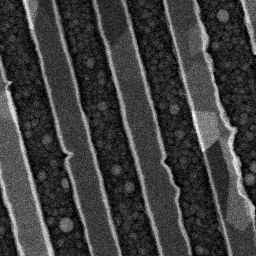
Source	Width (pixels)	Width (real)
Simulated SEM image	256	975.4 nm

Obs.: one or a few lines or trenches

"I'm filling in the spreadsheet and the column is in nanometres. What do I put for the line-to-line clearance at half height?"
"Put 148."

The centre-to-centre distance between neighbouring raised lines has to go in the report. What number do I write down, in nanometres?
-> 258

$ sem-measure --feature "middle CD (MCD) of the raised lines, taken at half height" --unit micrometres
0.107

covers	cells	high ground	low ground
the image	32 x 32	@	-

---@@@@-----@@@@-----@@@@-----@@
---@@@@-----@@@@-----@@@@------@
----@@@-----@@@@-----@@@@------@
----@@@------@@@-----@@@@------@
----@@@@-----@@@@-----@@@@-----@
-----@@@-----@@@@-----@@@@------
-----@@@------@@@-----@@@@------
-----@@@@-----@@@-----@@@@------
-----@@@@-----@@@@-----@@@------
------@@@-----@@@@-----@@@@-----
@-----@@@@-----@@@-----@@@@-----
@-----@@@@-----@@@-----@@@@-----
@-----@@@@-----@@@@-----@@@-----
@@-----@@@-----@@@@-----@@@@----
@@-----@@@-----@@@@-----@@@@----
@@-----@@@@-----@@@@----@@@@----
@@-----@@@@-----@@@@-----@@@@---
@@@-----@@@-----@@@@-----@@@@---
@@@-----@@@@-----@@@-----@@@@---
@@@------@@@-----@@@@-----@@@---
@@@-----@@@@-----@@@@-----@@@@--
@@@@-----@@@-----@@@@-----@@@@--
@@@@-----@@@@-----@@@-----@@@@--
@@@@-----@@@@-----@@@@-----@@@--
-@@@-----@@@@-----@@@@-----@@@@-
-@@@@-----@@@-----@@@@-----@@@@-
-@@@@-----@@@@-----@@@-----@@@@@
--@@@-----@@@@-----@@@@-----@@@@
--@@@------@@@-----@@@@-----@@@@
--@@@@-----@@@------@@@-----@@@@
--@@@@-----@@@@-----@@@@----@@@@
---@@@-----@@@@-----@@@@-----@@@